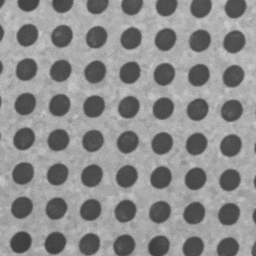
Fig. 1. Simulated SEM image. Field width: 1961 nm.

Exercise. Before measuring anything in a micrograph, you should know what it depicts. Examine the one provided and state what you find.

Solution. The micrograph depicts a regular array of holes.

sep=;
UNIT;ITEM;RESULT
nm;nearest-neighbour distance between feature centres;262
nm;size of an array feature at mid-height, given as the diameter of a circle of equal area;173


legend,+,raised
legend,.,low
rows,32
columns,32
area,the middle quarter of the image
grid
..++++....++++.....++++....+++++
..+++......+++.....++++.....+++.
..+++.....++++.....+++......+++.
.++++.....++++.....++++.....+++.
++++++...++++++...+++++....++++.
++++++++++++++++++++++++.+++++++
++++++++++++++++++++++++++++++++
++++++++++++++++++++++++++++++++
.+++++....+++++...++++++..++++++
..+++.....++++.....++++....++++.
..+++.....++++.....+++......+++.
.++++.....+++......+++......+++.
.++++....+++++....++++.....++++.
+++++++++++++++..++++++...+++++.
++++++++++++++++++++++++++++++++
++++++++++++++++++++++++++++++++
+++++++..+++++++++++++++++++++++
.++++.....++++....+++++...++++++
.++++.....+++......+++.....++++.
.+++......+++......+++......++..
.++++.....+++.....++++.....+++..
+++++....+++++....++++.....++++.
+++++++++++++++++++++++..+++++++
++++++++++++++++++++++++++++++++
++++++++++++++++++++++++++++++++
.+++++...++++++..+++++++.+++++++
.++++.....++++....++++.....++++.
.+++......+++......+++.....+++..
.+++......+++......+++.....+++..
++++.....++++.....+++......+++..
+++++...++++++...+++++....+++++.
++++++++++++++++++++++++++++++++